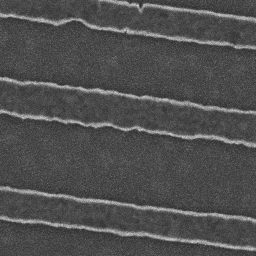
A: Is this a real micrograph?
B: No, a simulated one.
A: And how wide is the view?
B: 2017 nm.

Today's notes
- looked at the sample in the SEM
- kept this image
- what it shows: one or a few lines or trenches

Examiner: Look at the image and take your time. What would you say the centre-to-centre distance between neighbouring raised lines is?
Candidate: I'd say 809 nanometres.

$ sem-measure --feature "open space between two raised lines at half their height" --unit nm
555